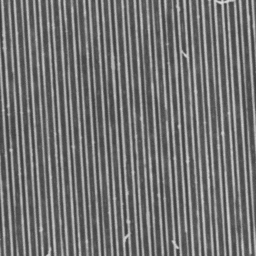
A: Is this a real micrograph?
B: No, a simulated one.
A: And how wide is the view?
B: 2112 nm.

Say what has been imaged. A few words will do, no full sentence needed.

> parallel lines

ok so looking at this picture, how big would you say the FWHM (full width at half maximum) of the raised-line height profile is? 15.5 nm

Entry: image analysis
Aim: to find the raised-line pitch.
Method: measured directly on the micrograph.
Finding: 51.6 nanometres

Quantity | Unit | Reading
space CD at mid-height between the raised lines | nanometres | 39.2